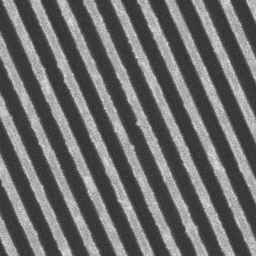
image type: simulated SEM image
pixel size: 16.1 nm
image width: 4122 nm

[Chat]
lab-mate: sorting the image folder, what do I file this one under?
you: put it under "parallel lines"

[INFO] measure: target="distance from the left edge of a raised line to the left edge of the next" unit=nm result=398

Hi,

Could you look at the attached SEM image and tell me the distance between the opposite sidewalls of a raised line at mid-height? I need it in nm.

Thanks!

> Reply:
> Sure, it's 176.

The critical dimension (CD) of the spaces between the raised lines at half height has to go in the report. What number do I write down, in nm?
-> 220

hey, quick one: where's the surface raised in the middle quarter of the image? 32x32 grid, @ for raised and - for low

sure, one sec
@@---@@@----@@@----@@@----@@@---
@@----@@-----@@----@@@----@@@---
@@----@@@----@@@----@@@----@@---
@@@----@@----@@@----@@@----@@@--
@@@----@@@----@@@----@@@---@@@--
-@@@----@@----@@@----@@@----@@@-
-@@@----@@@----@@-----@@----@@@-
--@@@----@@----@@@----@@@----@@@
--@@@----@@@----@@----@@@----@@@
---@@@---@@@----@@@----@@@----@@
---@@@----@@@----@@----@@@----@@
----@@----@@@----@@@----@@@----@
----@@@----@@-----@@----@@@----@
@---@@@----@@@----@@@----@@@---@
@----@@@----@@----@@@----@@@----
@----@@@----@@@----@@@----@@@---
@@----@@@----@@----@@@----@@@---
@@----@@@----@@@----@@-----@@---
@@@----@@@---@@@----@@@----@@@--
@@@----@@@----@@@----@@----@@@--
-@@@----@@----@@@----@@@----@@@-
-@@@----@@@----@@@----@@----@@@-
--@@@---@@@----@@@----@@@----@@@
--@@@----@@@----@@----@@@----@@@
---@@@---@@@----@@@----@@@----@@
---@@@----@@@----@@----@@@----@@
---@@@----@@@----@@@----@@@----@
----@@@----@@@---@@@----@@@----@
----@@@----@@@----@@@----@@----@
@----@@@----@@@---@@@----@@@----
@----@@@----@@@----@@-----@@----
@@----@@@---@@@----@@@----@@@---